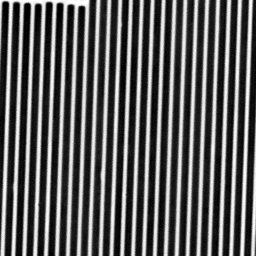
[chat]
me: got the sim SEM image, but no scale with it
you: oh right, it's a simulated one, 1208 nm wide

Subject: parallel lines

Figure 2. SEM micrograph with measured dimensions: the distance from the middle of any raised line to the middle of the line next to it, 51.4 nm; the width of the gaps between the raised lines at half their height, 30.1 nanometers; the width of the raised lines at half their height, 4.49 px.